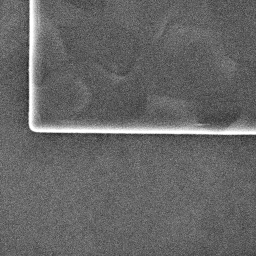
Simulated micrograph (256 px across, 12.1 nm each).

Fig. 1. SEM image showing wiring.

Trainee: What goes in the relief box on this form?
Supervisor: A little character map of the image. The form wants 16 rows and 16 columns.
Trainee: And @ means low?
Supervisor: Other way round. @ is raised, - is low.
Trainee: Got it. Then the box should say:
--@@@@@@@@@@@@@@
--@@@@@@@@@@@@@@
--@@@@@@@@@@@@@@
--@@@@@@@@@@@@@@
--@@@@@@@@@@@@@@
--@@@@@@@@@@@@@@
--@@@@@@@@@@@@@@
--@@@@@@@@@@@@@@
----------------
----------------
----------------
----------------
----------------
----------------
----------------
----------------